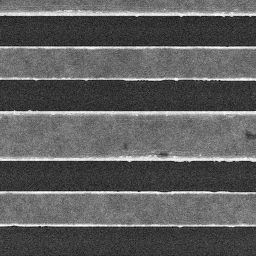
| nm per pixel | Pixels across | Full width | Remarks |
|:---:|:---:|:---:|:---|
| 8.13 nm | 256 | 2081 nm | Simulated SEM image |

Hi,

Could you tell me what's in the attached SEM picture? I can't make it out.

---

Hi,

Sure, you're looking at lines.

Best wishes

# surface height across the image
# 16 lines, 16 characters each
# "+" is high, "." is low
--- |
++++++++++++++++
................
................
++++++++++++++++
++++++++++++++++
................
................
++++++++++++++++
++++++++++++++++
++++++++++++++++
................
................
++++++++++++++++
++++++++++++++++
................
................